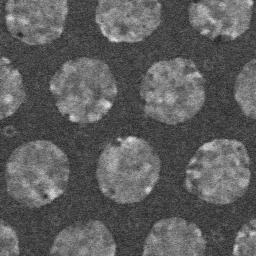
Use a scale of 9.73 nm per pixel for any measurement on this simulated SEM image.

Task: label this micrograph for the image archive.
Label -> raised bodies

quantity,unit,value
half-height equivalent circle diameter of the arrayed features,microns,0.574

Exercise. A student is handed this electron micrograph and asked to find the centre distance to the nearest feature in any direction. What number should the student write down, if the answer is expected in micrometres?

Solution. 0.876